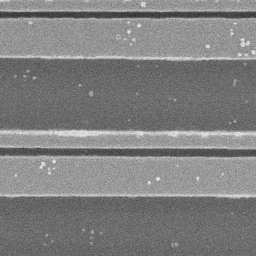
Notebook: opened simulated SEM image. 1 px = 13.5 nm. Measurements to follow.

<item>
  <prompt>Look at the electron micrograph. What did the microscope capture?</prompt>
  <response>lines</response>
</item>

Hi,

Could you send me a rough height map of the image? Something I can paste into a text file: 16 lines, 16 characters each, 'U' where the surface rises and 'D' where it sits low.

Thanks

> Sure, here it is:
UUUUUUUUUUUUUUUU
UUUUUUUUUUUUUUUU
UUUUUUUUUUUUUUUU
UUUUUUUUUUUUUUUU
DDDDDDDDDDDDDDDD
DDDDDDDDDDDDDDDD
DDDDDDDDDDDDDDDD
DDDDDDDDDDDDDDDD
UUUUUUUUUUUUUUUU
UUUUUUUUUUUUUUUU
UUUUUUUUUUUUUUUU
UUUUUUUUUUUUUUUU
DDDDDDDDDDDDDDDD
DDDDDDDDDDDDDDDD
DDDDDDDDDDDDDDDD
DDDDDDDDDDDDDDDD